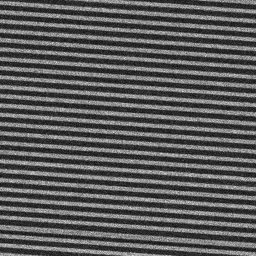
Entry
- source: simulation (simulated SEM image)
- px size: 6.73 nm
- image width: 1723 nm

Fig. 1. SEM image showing parallel lines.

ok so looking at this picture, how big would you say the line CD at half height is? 26 nm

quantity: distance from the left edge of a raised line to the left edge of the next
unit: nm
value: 62.6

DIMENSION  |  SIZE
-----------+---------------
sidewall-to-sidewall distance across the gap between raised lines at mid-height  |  32.7 nm